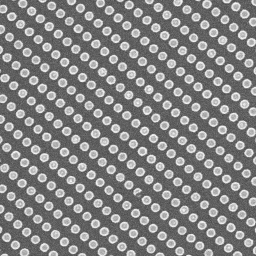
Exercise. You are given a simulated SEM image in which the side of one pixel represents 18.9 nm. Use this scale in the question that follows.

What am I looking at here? a regular array of raised bodies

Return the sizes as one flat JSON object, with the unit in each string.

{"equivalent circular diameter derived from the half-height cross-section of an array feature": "0.148 micrometres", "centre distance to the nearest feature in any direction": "218 nm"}